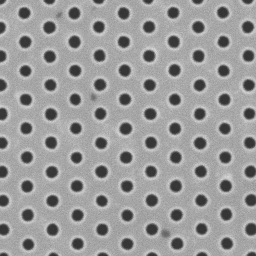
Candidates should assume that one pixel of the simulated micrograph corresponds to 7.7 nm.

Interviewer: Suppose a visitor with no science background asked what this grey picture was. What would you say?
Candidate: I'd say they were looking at a regular array of holes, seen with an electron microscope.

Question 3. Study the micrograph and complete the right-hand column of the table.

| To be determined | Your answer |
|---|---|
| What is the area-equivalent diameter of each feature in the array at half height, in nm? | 93.6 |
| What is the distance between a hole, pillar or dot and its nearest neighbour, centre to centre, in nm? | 218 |